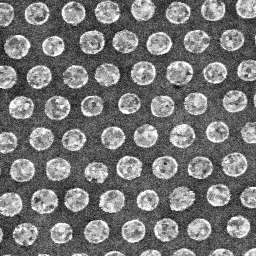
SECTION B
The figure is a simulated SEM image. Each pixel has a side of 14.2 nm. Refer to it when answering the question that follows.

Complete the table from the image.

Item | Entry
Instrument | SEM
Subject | a regular array of raised bodies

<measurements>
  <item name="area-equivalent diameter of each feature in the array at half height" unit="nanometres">318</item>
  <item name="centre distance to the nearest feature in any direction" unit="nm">479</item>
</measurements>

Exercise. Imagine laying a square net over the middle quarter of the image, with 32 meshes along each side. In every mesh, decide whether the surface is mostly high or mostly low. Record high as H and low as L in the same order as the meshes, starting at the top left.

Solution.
LLLLLLLLLHHHHLLLLLHHHHLLLLLHHHHL
LHHHHLLLHHHHHLLLLHHHHHLLLLHHHHHH
HHHHHHLLHHHHHHLLLHHHHHHLLLHHHHHH
HHHHHHLLHHHHHHLLLHHHHHLLLLHHHHHH
HHHHHLLLLHHHHLLLLLHHHLLLLLLHHHHL
LHHHLLLLLLLLLLLLLLLLLLLLLLLLLLLL
LLLLLLLLLLLLLLLLLLLLLLLLLLLLLLLL
LLLLLLLLLLLLLLLLLLLLLLLLLLLLLLLL
LLLLLLHHHLLLLLHHHHLLLLLHHHLLLLLH
HLLLLHHHHHLLLLHHHHHLLLHHHHHLLLHH
HLLLLHHHHHLLLLHHHHHLLLHHHHHLLLHH
HLLLLHHHHLLLLLHHHHLLLLHHHHHLLLLH
HLLLLHHHLLLLLLLLLLLLLLLHHHLLLLLL
LLLLLLLLLLLLLLLLLLLLLLLLLLLLLLLL
LLLLLLLLLLLLLLLLLLLLLLLLLLLLLLLL
LLLLLLLLLLLLLLLLLLLLHHLLLLLLLHHL
LLLLLLLLLLLHHHLLLLHHHHHLLLLHHHHH
LHHHHLLLLLHHHHHLLLHHHHHLLLLHHHHH
HHHHHLLLLLHHHHHLLLHHHHHLLLLHHHHH
HHHHHLLLLLHHHHHLLLHHHHHLLLLHHHHH
HHHHLLLLLLHHHHLLLLLHHLLLLLLLLHHL
LLHLLLLLLLLLLLLLLLLLLLLLLLLLLLLL
LLLLLLLLLLLLLLLLLLLLLLLLLLLLLLLL
LLLLLLLLLLLLLLLHHLLLLLLLHHHLLLLL
HLLLLLLLLLLLLLHHHHHLLLLHHHHHLLLL
HHLLLLHHHHLLLHHHHHHLLLHHHHHHLLLH
HLLLLHHHHHHLLHHHHHHLLLHHHHHHLLLH
HLLLLHHHHHHLLLHHHHHLLLLHHHHHLLLL
LLLLLLHHHHLLLLLHHLLLLLLLLHLLLLLL
LLLLLLLHHLLLLLLLLLLLLLLLLLLLLLLL
LLLLLLLLLLLLLLLLLLLLLLLLLLLLLLLL
LLHHHLLLLLLLLLLLLLLLLLLLLLLLHHHL